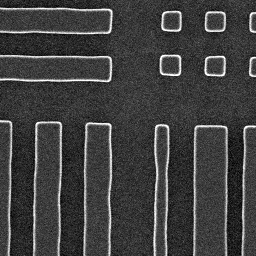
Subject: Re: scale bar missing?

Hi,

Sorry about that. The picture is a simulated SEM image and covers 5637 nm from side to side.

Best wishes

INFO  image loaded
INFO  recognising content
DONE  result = groups of lines, slits or small figures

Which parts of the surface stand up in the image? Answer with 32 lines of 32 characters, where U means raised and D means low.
DDDDDDDDDDDDDDDDDDDDDDDDDDDDDDDD
UUUUUUUUUUUUUUDDDDDDDDDDDDDDDDDD
UUUUUUUUUUUUUUDDDDDDUUUDDDUUDDDU
UUUUUUUUUUUUUUDDDDDDUUDDDDUUDDDU
DDDDDDDDDDDDDDDDDDDDDDDDDDDDDDDD
DDDDDDDDDDDDDDDDDDDDDDDDDDDDDDDD
DDDDDDDDDDDDDDDDDDDDDDDDDDDDDDDD
UUUUUUUUUUUUUUDDDDDDUUUDDDUUDDDU
UUUUUUUUUUUUUUDDDDDDUUUDDDUUDDDU
UUUUUUUUUUUUUUDDDDDDDDDDDDDDDDDD
DDDDDDDDDDDDDDDDDDDDDDDDDDDDDDDD
DDDDDDDDDDDDDDDDDDDDDDDDDDDDDDDD
DDDDDDDDDDDDDDDDDDDDDDDDDDDDDDDD
DDDDDDDDDDDDDDDDDDDDDDDDDDDDDDDD
DDDDDDDDDDDDDDDDDDDDDDDDDDDDDDDD
UDDDDUUUDDDUUDDDDDDDDDDDDDDDDDDD
UDDDUUUUDDDUUUDDDDDUUDDDUUUUDDUU
UDDDUUUUDDDUUUDDDDDUUDDDUUUUDDUU
UDDDUUUUDDDUUUDDDDDUUDDDUUUUDDDU
UDDDUUUUDDDUUUDDDDDUUDDDUUUUDDDU
UDDDUUUUDDDUUUDDDDDUUDDDUUUUDDUU
UDDDUUUUDDDUUUDDDDDDUDDDUUUUDDUU
UDDDUUUUDDDUUUDDDDDUUDDDUUUUDDUU
UDDDUUUUDDDUUUDDDDDUUDDDUUUUDDUU
UDDDUUUDDDDUUUDDDDDUUDDDUUUUDDUU
UDDDUUUDDDDUUUDDDDDUUDDDUUUUDDUU
UDDDUUUDDDDUUUDDDDDUUDDDUUUUDDUU
UDDDUUUDDDDUUUDDDDDUUDDDUUUUDDUU
UDDDUUUDDDDUUUDDDDDUUDDDUUUUDDUU
UDDDUUUDDDDUUUDDDDDUUDDDUUUUDDUU
UDDDUUUDDDDUUUDDDDDUUDDDUUUUDDUU
UDDDUUUDDDDUUUDDDDDUUDDDUUUUDDUU